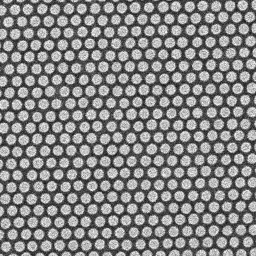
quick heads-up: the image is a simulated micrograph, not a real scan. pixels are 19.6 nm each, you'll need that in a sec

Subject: a regular array of raised bodies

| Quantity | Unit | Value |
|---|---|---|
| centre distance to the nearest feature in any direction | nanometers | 254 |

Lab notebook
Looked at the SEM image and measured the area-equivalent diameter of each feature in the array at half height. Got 193 nm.